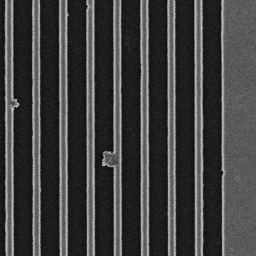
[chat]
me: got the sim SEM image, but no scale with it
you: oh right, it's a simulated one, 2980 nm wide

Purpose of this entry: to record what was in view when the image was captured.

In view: parallel lines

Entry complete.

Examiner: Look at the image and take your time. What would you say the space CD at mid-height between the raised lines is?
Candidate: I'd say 239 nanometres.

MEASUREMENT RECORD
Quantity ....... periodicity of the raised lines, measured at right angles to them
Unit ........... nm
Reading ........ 315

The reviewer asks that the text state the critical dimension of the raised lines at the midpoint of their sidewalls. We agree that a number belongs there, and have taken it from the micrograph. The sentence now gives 68.4 nanometers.